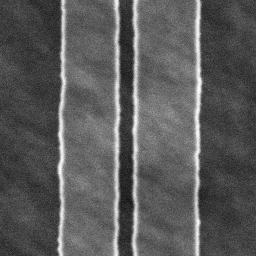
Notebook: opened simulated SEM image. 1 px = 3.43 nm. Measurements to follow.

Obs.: lines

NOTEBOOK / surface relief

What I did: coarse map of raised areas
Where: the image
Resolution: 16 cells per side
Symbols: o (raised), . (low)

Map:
....oooooooo....
....oooooooo....
....oooooooo....
....oooooooo....
....oooooooo....
....oooooooo....
....oooooooo....
....oooooooo....
....oooooooo....
....oooooooo....
....oooooooo....
....oooooooo....
....oooooooo....
....oooooooo....
....oooooooo....
....oooooooo....